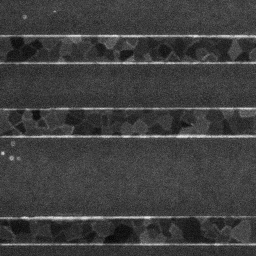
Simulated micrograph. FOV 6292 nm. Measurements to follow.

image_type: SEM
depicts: lines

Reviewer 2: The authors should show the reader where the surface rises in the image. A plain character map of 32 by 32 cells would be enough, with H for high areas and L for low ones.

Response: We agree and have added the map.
LLLLLLLLLLLLLLLLLLLLLLLLLLLLLLLL
LLLLLLLLLLLLLLLLLLLLLLLLLLLLLLLL
LLLLLLLLLLLLLLLLLLLLLLLLLLLLLLLL
LLLLLLLLLLLLLLLLLLLLLLLLLLLLLLLL
HHHHHHHHHHHHHHHHHHHHHHHHHHHHHLLL
HHHHHHHHHHHHHHHHHHHHHHHHHHHHHHHH
HHHHHHHHHHHHHHHHHHHHHHHHHHHHHHHH
HHHHHHHHHHHHHHHHHHHHHHHHHHHHHHHH
LLLLLLLLLLLLLLLLLLLLLLLLLLLLLLLL
LLLLLLLLLLLLLLLLLLLLLLLLLLLLLLLL
LLLLLLLLLLLLLLLLLLLLLLLLLLLLLLLL
LLLLLLLLLLLLLLLLLLLLLLLLLLLLLLLL
LLLLLLLLLLLLLLLLLLLLLLLLLLLLLLLL
LLLLLLLLLLLLLLLLLLLLLLLLLLLLLLLL
HHHHHHHHHHHHHHHHHHHHHHHHHHHHHHHH
HHHHHHHHHHHHHHHHHHHHHHHHHHHHHHHH
HHHHHHHHHHHHHHHHHHHHHHHHHHHHHHHH
LLLLLLLLLLLLLLLLLLLLLLLLLLLLLLLL
LLLLLLLLLLLLLLLLLLLLLLLLLLLLLLLL
LLLLLLLLLLLLLLLLLLLLLLLLLLLLLLLL
LLLLLLLLLLLLLLLLLLLLLLLLLLLLLLLL
LLLLLLLLLLLLLLLLLLLLLLLLLLLLLLLL
LLLLLLLLLLLLLLLLLLLLLLLLLLLLLLLL
LLLLLLLLLLLLLLLLLLLLLLLLLLLLLLLL
LLLLLLLLLLLLLLLLLLLLLLLLLLLLLLLL
LLLLLLLLLLLLLLLLLLLLLLLLLLLLLLLL
LLLLLLLLLLLLLLLLLLLLLLLLLLLLLLLL
HHHHHHHHHHHHHHHHHHHHHHHHHHHHHHHH
HHHHHHHHHHHHHHHHHHHHHHHHHHHHHHHH
HHHHHHHHHHHHHHHHHHHHHHHHHHHHHHHH
HHHHHHHHHHHHHHHHHHHHHHHHHHHHHHHH
LLLLLLLLLLLLLLLLLLLLLLLLLLLLLLLL